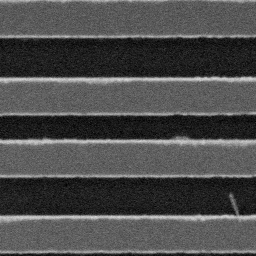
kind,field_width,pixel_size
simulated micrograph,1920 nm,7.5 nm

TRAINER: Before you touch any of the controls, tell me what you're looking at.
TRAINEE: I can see lines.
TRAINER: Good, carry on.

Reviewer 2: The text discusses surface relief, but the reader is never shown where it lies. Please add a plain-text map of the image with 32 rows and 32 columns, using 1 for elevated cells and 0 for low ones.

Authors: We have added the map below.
11111111111111111111111111111111
11111111111111111111111111111111
11111111111111111111111111111111
11111111111111111111111111111111
11111111111111111111111111111111
00000000000000000000000000000000
00000000000000000000000000000000
00000000000000000000000000000000
00000000000000000000000000000000
00000000000000000000000000000000
11111111111111111111111111111111
11111111111111111111111111111111
11111111111111111111111111111111
11111111111111111111111111111111
00000000000000000000000000000000
00000000000000000000000000000000
00000000000000000000000000000000
00000000000000000000000000000000
11111111111111111111111111111111
11111111111111111111111111111111
11111111111111111111111111111111
11111111111111111111111111111111
00000000000000000000000000000000
00000000000000000000000000000000
00000000000000000000000000000000
00000000000000000000000000000000
00000000000000000000000000000000
11111111111111111111111111111111
11111111111111111111111111111111
11111111111111111111111111111111
11111111111111111111111111111111
11111111111111111111111111111111